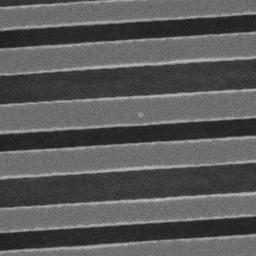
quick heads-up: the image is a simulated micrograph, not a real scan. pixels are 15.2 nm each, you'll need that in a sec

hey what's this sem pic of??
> lines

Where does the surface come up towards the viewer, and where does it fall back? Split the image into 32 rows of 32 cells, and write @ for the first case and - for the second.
-------@@@@@@@@@@@@@@@@@@@@@@@@@
@@@@@@@@@@@@@@@@@@@@@@@@@@@@@@@@
@@@@@@@@@@@@@@@@@@@@@-----------
@@@@@---------------------------
------------------------@@@@@@@@
---------@@@@@@@@@@@@@@@@@@@@@@@
@@@@@@@@@@@@@@@@@@@@@@@@@@@@@@@@
@@@@@@@@@@@@@@@@@@@@@@@@@@@@@---
@@@@@@@@@@@@--------------------
--------------------------------
--------------------------------
--------------------------@@@@@@
-----------@@@@@@@@@@@@@@@@@@@@@
@@@@@@@@@@@@@@@@@@@@@@@@@@@@@@@@
@@@@@@@@@@@@@@@@@@@@@@@@@@@@@@@@
@@@@@@@@@@@@@@@@@@@@------------
@@@@----------------------------
-------------------------@@@@@@@
--------@@@@@@@@@@@@@@@@@@@@@@@@
@@@@@@@@@@@@@@@@@@@@@@@@@@@@@@@@
@@@@@@@@@@@@@@@@@@@@@@@@@@@@@---
@@@@@@@@@@@@@@------------------
--------------------------------
--------------------------------
-------------------------@@@@@@@
---------@@@@@@@@@@@@@@@@@@@@@@@
@@@@@@@@@@@@@@@@@@@@@@@@@@@@@@@@
@@@@@@@@@@@@@@@@@@@@@@@@--------
@@@@@@@@@-----------------------
-----------------------------@@@
---------------@@@@@@@@@@@@@@@@@
@@@@@@@@@@@@@@@@@@@@@@@@@@@@@@@@